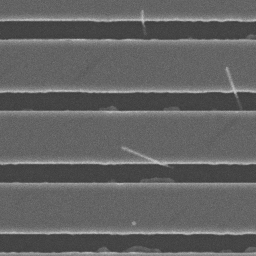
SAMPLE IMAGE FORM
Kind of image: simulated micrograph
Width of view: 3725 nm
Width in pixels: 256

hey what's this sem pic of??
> lines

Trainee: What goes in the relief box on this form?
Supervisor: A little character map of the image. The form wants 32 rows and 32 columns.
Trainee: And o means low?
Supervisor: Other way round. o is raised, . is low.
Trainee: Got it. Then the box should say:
oooooooooooooooooooooooooooooooo
oooooooooooooooooooooooooooooooo
oooooooooooooooooooooooooooooooo
................................
................................
oooooooooooooooooooooooooooooooo
oooooooooooooooooooooooooooooooo
oooooooooooooooooooooooooooooooo
oooooooooooooooooooooooooooooooo
oooooooooooooooooooooooooooooooo
oooooooooooooooooooooooooooooooo
oooooo....oooooooooooooooo.ooo.o
................................
................................
oooooooooooooooooooooooooooooooo
oooooooooooooooooooooooooooooooo
oooooooooooooooooooooooooooooooo
oooooooooooooooooooooooooooooooo
oooooooooooooooooooooooooooooooo
oooooooooooooooooooooooooooooooo
oo..........ooo.....o.....oooooo
................................
................................
oooooooooooooooooooooooooooooooo
oooooooooooooooooooooooooooooooo
oooooooooooooooooooooooooooooooo
oooooooooooooooooooooooooooooooo
oooooooooooooooooooooooooooooooo
oooooooooooooooooooooooooooooooo
................................
................................
................................